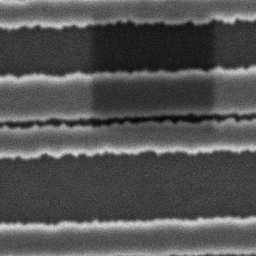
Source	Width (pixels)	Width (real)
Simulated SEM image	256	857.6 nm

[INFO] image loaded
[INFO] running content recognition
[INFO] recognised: lines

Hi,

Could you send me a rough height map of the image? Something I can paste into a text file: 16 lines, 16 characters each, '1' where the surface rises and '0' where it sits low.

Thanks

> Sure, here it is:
1111111111111111
1111111000000000
0000000000000000
0000000000000000
0000000001011111
1111111111111111
1111111111111111
1111111111111111
1111111111111111
1111111110001000
0000000000000000
0000000000000000
0000000000000000
0000000000000000
1111111111111111
1111111111111111